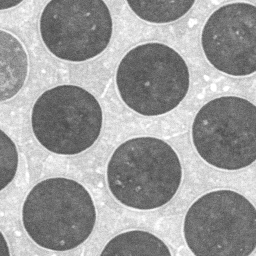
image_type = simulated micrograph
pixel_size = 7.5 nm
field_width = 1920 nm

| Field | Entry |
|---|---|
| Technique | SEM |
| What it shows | holes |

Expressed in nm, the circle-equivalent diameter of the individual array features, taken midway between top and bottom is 556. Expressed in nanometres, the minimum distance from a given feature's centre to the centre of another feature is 706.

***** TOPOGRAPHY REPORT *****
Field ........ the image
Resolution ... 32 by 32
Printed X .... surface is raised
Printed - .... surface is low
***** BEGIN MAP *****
--XXXX-------XXX--------XXXX---X
XXXXX---------XXX------XXXX-----
XXXXX---------XXXX----XXXX------
XXXXX---------XXXXXXXXXXX-------
--XXX---------XXXXXXXXXXX-------
---XXX--------XXXX---XXXX-------
---XXX-------XXX------XXX-------
---XXXXX---XXXX--------XXX------
---XXXXXXXXXXXX---------XXX-----
---XXXXXXXXXXX----------XXXXXXXX
---XXXXXXXXXXX----------XXXXXXXX
--XXXX-----XXXX--------XXXXXXXXX
-XXXX-------XXX--------XXX-----X
XXXX---------XXX------XXX-------
XXXX---------XXXXXXXXXXX--------
XXXX---------XXXXXXXXXXX--------
XXXX---------XXXXXXXXXXX--------
-XXXX-------XXXX----XXXX--------
--XXXX-----XXXX-------XX--------
--XXXXXXXXXXXX--------XXX-------
--XXXXXXXXXXX----------XXX-----X
--XXXXXXXXXXX----------XXXXXXXXX
--XXX----XXXX----------XXXXXXXXX
-XXX-------XXX--------XXXXXXXXXX
XXX--------XXX--------XXX-----XX
XXX---------XXX------XXX--------
XXX---------XXXXXXXXXXX---------
XXX---------XXXXXXXXXXX---------
XXX---------XXXXXXXXXXX---------
XXXX-------XXX------XXX---------
-XXXX-----XXX--------XX---------
-XXXXXXXXXXXX--------XXX--------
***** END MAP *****